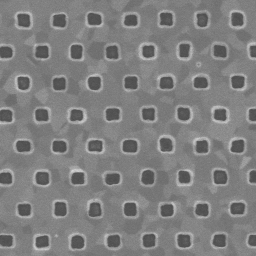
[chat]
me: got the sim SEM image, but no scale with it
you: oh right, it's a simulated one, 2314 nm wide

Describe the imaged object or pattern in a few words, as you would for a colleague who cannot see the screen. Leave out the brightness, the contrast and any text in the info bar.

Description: a regular array of holes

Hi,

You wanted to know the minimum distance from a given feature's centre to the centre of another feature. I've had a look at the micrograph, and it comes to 35.2 pixels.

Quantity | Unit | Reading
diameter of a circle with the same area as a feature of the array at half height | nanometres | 138